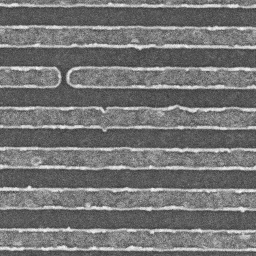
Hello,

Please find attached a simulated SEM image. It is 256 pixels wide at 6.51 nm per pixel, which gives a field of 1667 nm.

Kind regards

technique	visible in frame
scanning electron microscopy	parallel lines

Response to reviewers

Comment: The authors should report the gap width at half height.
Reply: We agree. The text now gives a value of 132 nanometres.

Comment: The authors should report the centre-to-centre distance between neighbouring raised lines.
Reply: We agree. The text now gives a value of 264 nanometers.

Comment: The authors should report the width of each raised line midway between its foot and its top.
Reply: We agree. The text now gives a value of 0.131 micrometres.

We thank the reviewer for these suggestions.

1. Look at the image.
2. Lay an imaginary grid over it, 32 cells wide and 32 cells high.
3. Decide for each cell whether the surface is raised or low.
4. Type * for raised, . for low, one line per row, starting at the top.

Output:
********************************
................................
................................
******************.***.********.
********************************
********************************
................................
................................
*******...**.***...***...**..***
********************************
*******..***********************
................................
................................
**..*...*****.*****..**.....*...
********************************
********************************
................................
................................
*..**...**....*.................
********************************
********************************
................................
................................
**.*............................
********************************
********************************
................................
................................
................................
********************************
********************************
................................